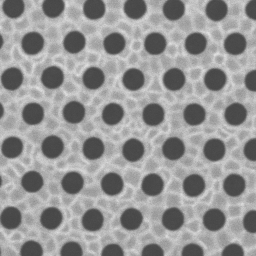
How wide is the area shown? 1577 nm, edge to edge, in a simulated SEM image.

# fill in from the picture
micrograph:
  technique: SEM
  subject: a regular array of holes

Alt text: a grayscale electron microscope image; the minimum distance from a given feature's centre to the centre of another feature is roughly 244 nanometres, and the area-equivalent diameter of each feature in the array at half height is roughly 137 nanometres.